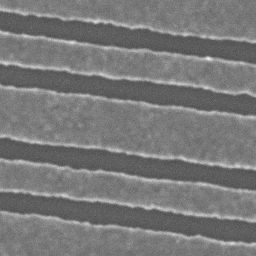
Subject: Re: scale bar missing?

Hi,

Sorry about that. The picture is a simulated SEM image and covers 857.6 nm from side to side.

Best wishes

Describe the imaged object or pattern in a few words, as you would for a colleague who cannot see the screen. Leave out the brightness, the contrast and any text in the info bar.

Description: lines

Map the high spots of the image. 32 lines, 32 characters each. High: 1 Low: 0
11111111111111111111111111111111
00111111111111111111111111111111
00000000001111111111111111111111
00000000000000001011111111111111
11110000000000000000000011111111
11111111111000000000000000000000
11111111111111111110000000000000
11111111111111111111111111110000
00001111111111111111111111111111
00000000000001111111111111111111
00000000000000000000001111111111
11111110000000000000000000001111
11111111111111100000000000000000
11111111111111111111111000000000
11111111111111111111111111111100
11111111111111111111111111111111
11111111111111111111111111111111
00111111111111111111111111111111
00000000000011111111111111111111
00000000000000000011111111111111
11111100000000000000000000111111
11111111111111000000000000000000
11111111111111111111000000000000
11111111111111111111111111110000
00000011111111111111111111111111
00000000000000011111111111111111
10000000000000000000001111111111
11111111000000000000000000000001
11111111111111110000000000000000
11111111111111111111111010000000
11111111111111111111111111111111
11111111111111111111111111111111